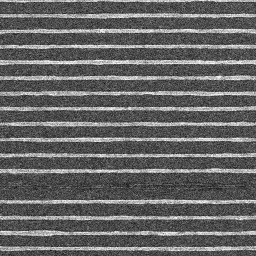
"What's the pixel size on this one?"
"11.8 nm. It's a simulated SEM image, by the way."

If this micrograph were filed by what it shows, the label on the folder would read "parallel lines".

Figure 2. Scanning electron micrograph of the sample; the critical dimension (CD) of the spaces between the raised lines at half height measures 146 nm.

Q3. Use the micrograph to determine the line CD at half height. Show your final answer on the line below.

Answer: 3.12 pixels